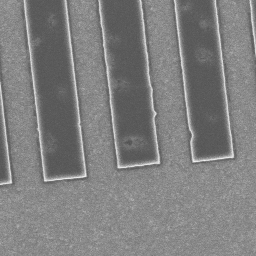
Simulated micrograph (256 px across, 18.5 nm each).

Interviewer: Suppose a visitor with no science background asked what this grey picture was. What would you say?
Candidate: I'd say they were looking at one or a few lines or trenches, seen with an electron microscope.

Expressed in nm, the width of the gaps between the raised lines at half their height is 617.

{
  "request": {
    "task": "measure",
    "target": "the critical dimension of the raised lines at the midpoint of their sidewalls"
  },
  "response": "41.7 px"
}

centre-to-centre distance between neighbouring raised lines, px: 74.5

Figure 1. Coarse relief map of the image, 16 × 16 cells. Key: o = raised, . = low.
..oo..ooo..ooo..
..oo..ooo..ooo..
..oo..ooo..ooo..
..oo...oo..ooo..
..ooo..oo..ooo..
..ooo..oo...oo..
..ooo..ooo..oo..
..ooo..ooo..oo..
..ooo..ooo..oo..
o..oo..ooo..oo..
o..oo...........
................
................
................
................
................